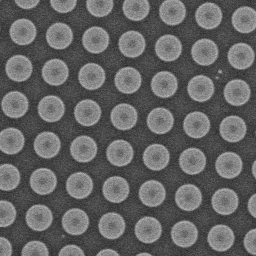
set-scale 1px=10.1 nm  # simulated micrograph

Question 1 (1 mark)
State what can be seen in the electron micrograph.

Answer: an array of small figures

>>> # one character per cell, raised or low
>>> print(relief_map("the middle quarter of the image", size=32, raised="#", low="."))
.....####.......................
#...######....####..............
#...######...######....####.....
#...######...######...######....
....######...######...######...#
.....####....######...######...#
..............####....######...#
.......................####....#
................................
....####........................
...######....####...............
...######...######....####......
...######...######...######.....
...######...######...######...##
....####....######...######...##
.............####....######...##
......................####....##
...............................#
...####.........................
..######....####................
..######...######....####.......
..######...######...######.....#
..######...######...######....##
...####....######...######...###
............####....######...###
.....................####....###
..............................##
..###...........................
.#####......##..................
.######...######.....##.........
.######...######...######.....##
.######...######...######....###